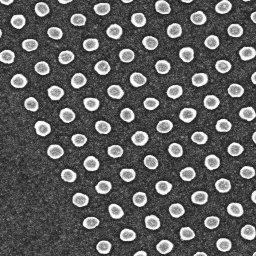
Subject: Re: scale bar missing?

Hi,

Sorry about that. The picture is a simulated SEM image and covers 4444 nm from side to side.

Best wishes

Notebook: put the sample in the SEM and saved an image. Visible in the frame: a regular array of raised bodies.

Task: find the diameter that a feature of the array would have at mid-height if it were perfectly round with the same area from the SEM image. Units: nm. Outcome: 234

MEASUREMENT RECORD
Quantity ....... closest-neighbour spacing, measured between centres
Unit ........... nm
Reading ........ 454